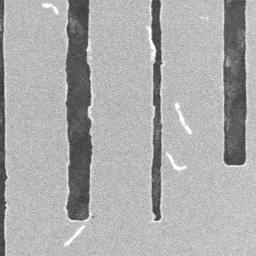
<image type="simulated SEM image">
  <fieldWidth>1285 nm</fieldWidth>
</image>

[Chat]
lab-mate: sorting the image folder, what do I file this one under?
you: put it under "one or a few lines or trenches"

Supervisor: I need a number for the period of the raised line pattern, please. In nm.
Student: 401